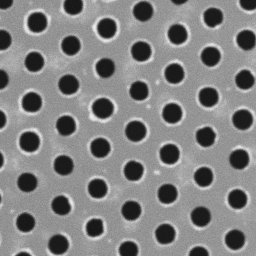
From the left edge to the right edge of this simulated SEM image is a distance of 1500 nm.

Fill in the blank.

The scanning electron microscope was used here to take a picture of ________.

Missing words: a regular array of holes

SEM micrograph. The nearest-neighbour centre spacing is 39.6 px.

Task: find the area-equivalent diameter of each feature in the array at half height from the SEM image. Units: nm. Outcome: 120